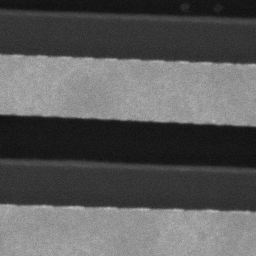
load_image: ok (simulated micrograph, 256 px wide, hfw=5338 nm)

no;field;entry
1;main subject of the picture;lines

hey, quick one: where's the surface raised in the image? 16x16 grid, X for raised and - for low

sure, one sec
----------------
XXXXXXXXXXXXXXXX
XXXXXXXXXXXXXXXX
XXXXXXXXXXXXXXXX
XXXXXXXXXXXXXXXX
XXXXXXXXXXXXXXXX
XXXXXXXXXXXXXXXX
--------XXXXXXXX
----------------
----------------
XXXXXXXXX-------
XXXXXXXXXXXXXXXX
XXXXXXXXXXXXXXXX
XXXXXXXXXXXXXXXX
XXXXXXXXXXXXXXXX
XXXXXXXXXXXXXXXX